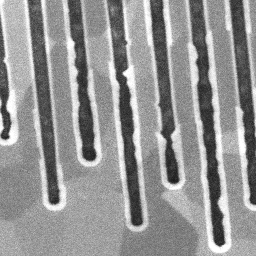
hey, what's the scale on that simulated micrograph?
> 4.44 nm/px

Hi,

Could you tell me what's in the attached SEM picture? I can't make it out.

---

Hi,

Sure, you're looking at parallel lines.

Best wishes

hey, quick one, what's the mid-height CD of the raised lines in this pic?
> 0.115 µm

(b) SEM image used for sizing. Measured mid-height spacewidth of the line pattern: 62.9 nanometers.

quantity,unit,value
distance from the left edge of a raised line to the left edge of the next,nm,179